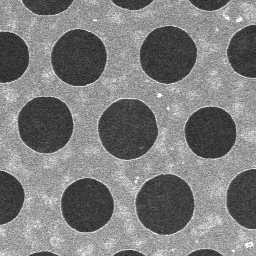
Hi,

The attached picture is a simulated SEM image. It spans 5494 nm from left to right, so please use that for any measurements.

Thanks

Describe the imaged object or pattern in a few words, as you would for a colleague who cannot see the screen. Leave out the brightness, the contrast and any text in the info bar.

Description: holes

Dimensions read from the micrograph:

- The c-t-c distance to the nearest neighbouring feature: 1680 nanometers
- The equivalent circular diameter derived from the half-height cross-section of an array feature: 1220 nanometers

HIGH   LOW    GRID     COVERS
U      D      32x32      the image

UUUDDDDDDUUUUUDDDDDUUUUUDDDDUUUU
UUUUDDDDUUUUUUUUUUUUUUUUUUUUUUUU
UUUUUUUUUUUUUUUUUUUUUUUUUUUUUUUU
UUUUUUUUUUUUUUUUUUUUDDUUUUUUUUUD
DDUUUUUUDDDDUUUUUUDDDDDDUUUUUDDD
DDDUUUUDDDDDDUUUUUDDDDDDUUUUUDDD
DDDDUUDDDDDDDUUUUDDDDDDDDUUUDDDD
DDDDUUDDDDDDDUUUUDDDDDDDDUUUDDDD
DDDUUUUDDDDDDUUUUUDDDDDDUUUUUDDD
DDDUUUUDDDDDDUUUUUUDDDDUUUUUUUDD
UUUUUUUUUDDUUUUUUUUUUUUUUUUUUUUU
UUUUUUUUUUUUUUUUUUUUUUUUUUUUUUUU
UUUUDDDDUUUUUUUDDUUUUUUUUUUUUUUU
UUUDDDDDDUUUUDDDDDDUUUUUUDDUUUUU
UUDDDDDDDUUUUDDDDDDUUUUUDDDDDUUU
UUDDDDDDDUUUDDDDDDDDUUUDDDDDDUUU
UUDDDDDDDUUUDDDDDDDDUUUDDDDDDDUU
UUUDDDDDDUUUUDDDDDDUUUUDDDDDDUUU
UUUUDDDDUUUUUDDDDDDUUUUUDDDDDUUU
UUUUUUUUUUUUUUDDDDUUUUUUUDDDUUUU
UUUUUUUUUUUUUUUUUUUUUUUUUUUUUUUU
DUUUUUUUUUUUUUUUUUUUUUUUUUUUUUDD
DDUUUUUUUUDDUUUUUUUDDDDUUUUUUDDD
DDDUUUUUDDDDDUUUUUDDDDDDUUUUDDDD
DDDUUUUUDDDDDDUUUDDDDDDDUUUUDDDD
DDDUUUUUDDDDDDUUUDDDDDDDUUUUDDDD
DDUUUUUUDDDDDDUUUDDDDDDDUUUUUDDD
DDUUUUUUDDDDDDUUUDDDDDDDUUUUUDDD
UUUUUUUUUDDDDUUUUUDDDDDUUUUUUUUD
UUUUUUUUUUUUUUUUUUUUUUUUUUUUUUUU
UUUUUUUUUUUUUUUUUUUUUUUUUUUUUUUU
UUUUUDUUUUUUUUUDDUUUUUUUDDDUUUUU